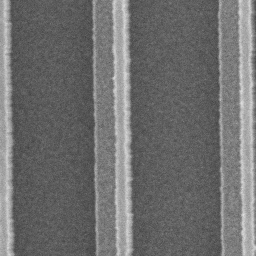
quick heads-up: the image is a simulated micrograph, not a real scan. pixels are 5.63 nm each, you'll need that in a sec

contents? lines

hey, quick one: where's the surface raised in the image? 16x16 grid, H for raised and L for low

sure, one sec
LLLLLLHHLLLLLLHH
LLLLLLHHLLLLLLHH
LLLLLLHHLLLLLLHH
LLLLLLHHLLLLLLHH
LLLLLLHHLLLLLLHH
HLLLLLHHLLLLLLHH
LLLLLLHHLLLLLLHH
HLLLLLHHLLLLLLHH
HLLLLLHHLLLLLLHH
HLLLLLHHLLLLLLHH
HLLLLLHHLLLLLLHH
HLLLLLHHLLLLLLHH
HLLLLLHHLLLLLLHH
HLLLLLHHLLLLLLHH
HLLLLLHHLLLLLLHH
HLLLLLHHLLLLLLHH